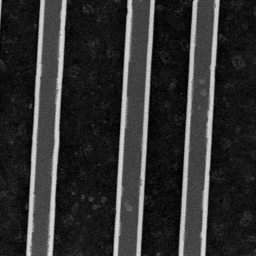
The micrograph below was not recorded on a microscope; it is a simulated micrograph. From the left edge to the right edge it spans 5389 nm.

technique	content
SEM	one or a few lines or trenches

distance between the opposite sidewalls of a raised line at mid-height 0.465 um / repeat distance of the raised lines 1600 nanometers